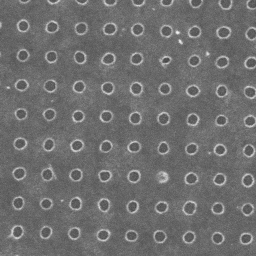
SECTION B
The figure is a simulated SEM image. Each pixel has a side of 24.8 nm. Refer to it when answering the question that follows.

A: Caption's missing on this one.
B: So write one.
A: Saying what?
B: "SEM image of a regular array of holes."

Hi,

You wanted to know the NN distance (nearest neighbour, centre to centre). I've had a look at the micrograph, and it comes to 0.705 um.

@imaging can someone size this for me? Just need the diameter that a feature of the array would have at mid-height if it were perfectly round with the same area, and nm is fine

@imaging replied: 256